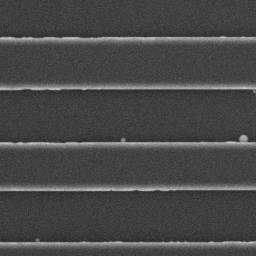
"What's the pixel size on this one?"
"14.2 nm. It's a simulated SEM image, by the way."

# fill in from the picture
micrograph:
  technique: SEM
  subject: lines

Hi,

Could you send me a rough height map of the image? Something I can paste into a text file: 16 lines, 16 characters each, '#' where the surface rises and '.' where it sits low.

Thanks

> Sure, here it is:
................
................
################
################
################
################
................
................
................
################
################
################
................
................
................
################